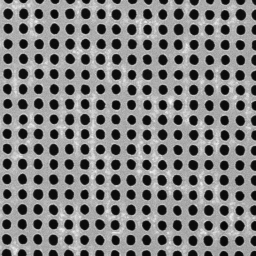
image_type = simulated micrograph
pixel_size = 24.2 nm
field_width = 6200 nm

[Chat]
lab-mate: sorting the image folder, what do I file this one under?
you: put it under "a regular array of holes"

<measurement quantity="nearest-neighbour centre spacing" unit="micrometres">0.36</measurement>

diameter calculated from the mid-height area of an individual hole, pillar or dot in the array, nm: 244